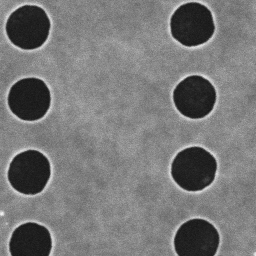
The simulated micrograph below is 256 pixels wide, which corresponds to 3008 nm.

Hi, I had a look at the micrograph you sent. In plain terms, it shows holes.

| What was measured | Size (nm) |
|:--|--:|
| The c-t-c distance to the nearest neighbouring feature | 846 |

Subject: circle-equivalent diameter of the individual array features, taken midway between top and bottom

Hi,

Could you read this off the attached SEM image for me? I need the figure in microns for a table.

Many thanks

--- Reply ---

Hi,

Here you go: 0.523